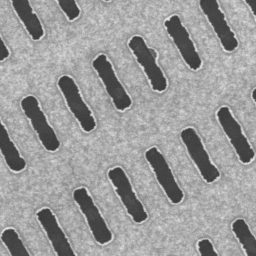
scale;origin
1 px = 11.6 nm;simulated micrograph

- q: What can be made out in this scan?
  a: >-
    a regular array of holes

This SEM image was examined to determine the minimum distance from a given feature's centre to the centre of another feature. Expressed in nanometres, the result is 476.